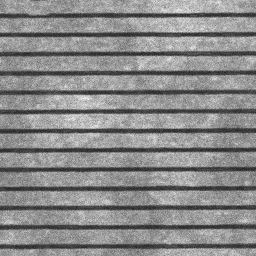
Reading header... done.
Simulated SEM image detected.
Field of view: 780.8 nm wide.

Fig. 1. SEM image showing parallel lines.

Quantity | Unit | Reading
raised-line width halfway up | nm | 41.2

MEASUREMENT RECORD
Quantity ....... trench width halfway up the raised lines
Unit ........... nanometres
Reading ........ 17.6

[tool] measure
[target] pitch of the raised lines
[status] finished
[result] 0.0587 um